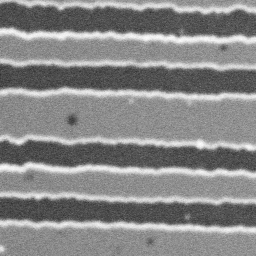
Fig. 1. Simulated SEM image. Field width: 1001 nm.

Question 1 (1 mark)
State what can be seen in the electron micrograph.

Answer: lines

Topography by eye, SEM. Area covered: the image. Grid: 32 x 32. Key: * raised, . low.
...*****************************
.........................*......
................................
................................
********************............
********************************
********************************
********************************
...........................*...*
................................
................................
****..******.*.**...............
********************************
********************************
********************************
********************************
********************************
.**...**************************
.............................*.*
................................
................................
**************************.****.
********************************
********************************
..******************************
................................
................................
................................
***************************..*..
********************************
********************************
********************************